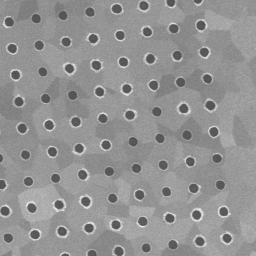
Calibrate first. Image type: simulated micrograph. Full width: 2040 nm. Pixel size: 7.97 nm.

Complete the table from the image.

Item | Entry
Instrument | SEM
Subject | a regular array of holes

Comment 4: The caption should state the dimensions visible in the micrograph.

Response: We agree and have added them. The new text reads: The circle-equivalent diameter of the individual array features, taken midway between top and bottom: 76.8 nm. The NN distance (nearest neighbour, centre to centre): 0.212 micrometres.